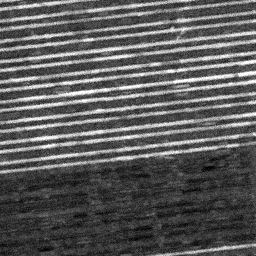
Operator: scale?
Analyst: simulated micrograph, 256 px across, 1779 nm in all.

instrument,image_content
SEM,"parallel lines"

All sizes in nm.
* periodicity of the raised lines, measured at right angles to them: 70.1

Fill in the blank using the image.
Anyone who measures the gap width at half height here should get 42.3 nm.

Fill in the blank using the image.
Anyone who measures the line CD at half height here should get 0.0172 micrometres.